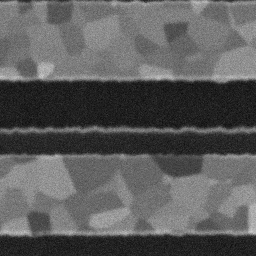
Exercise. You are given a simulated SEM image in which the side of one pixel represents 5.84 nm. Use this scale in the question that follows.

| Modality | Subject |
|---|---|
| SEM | lines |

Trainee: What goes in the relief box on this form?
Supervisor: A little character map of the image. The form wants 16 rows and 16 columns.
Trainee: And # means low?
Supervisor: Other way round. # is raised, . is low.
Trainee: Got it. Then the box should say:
################
################
################
################
################
................
................
................
................
................
################
################
################
################
###.######.#..##
................